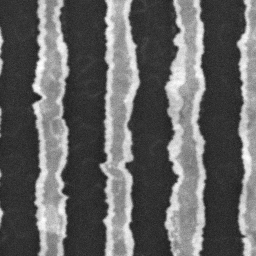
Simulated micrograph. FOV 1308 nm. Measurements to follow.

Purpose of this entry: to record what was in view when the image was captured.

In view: one or a few lines or trenches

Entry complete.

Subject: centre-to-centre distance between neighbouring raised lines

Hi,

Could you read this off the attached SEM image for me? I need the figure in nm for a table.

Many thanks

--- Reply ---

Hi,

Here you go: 346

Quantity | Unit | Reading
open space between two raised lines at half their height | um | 0.232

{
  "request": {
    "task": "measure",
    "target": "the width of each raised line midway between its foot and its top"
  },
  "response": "114 nanometers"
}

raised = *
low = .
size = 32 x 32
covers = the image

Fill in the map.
.....***.....***......***......*
.....**.......**......***......*
.....**......***......***......*
.....**.......**.......**......*
.....***......**.......**......*
.....***......**......***.....**
.....***......***.....***.....**
.....***......***......**.....**
.....***......***.....***.....**
.....***......***.....***......*
.....***.....****.....***......*
.....***......***....****......*
.....***.....***......***......*
.....***.....***......***.....**
.....***.....***......**......**
.....***.....***......**......**
.....***.....***......**......**
.....***.....***......***.....**
.....***.....***......***......*
.....***......**......***......*
.....***.....**.......***......*
.....**......***......***......*
.....***......**......***......*
.....***.....***......***......*
.....***......**......***.....**
.....***......**......***.....**
.....***......**.....****.....**
.....***......**.....****.....**
.....***......**.....****.....**
.....***......**.....****......*
.....**.......**.....****......*
.....***......**......***......*